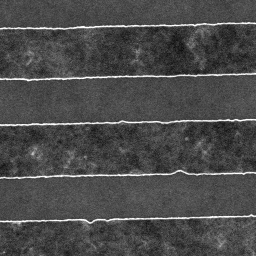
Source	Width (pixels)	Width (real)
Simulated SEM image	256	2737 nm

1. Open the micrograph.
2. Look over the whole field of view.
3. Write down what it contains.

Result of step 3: one or a few lines or trenches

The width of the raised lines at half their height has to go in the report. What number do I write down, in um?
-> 0.556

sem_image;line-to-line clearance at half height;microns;0.471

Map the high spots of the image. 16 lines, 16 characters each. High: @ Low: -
----------------
-------------@@@
@@@@@@@@@@@@@@@@
@@@@@@@@@@@@@@@@
@@@@@@@@@@@@@@@@
----------------
----------------
---------------@
@@@@@@@@@@@@@@@@
@@@@@@@@@@@@@@@@
@@@@@@@@@@@@@@@@
----------------
----------------
---------------@
@@@@@@@@@@@@@@@@
@@@@@@@@@@@@@@@@